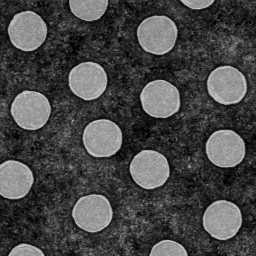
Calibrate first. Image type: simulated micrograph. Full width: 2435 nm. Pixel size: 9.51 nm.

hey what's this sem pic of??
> a regular array of raised bodies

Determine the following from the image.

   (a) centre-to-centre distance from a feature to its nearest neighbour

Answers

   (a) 0.607 µm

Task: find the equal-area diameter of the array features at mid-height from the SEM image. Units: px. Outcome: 38